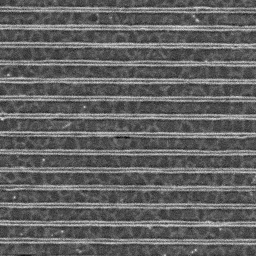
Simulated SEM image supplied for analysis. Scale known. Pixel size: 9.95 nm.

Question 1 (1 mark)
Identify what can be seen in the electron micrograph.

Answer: parallel lines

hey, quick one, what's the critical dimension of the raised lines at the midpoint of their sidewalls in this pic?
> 3.88 pixels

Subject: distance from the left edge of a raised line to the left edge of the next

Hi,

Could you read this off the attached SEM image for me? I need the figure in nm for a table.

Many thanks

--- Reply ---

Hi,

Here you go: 177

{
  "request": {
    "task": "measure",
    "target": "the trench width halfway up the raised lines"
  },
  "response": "139 nm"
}